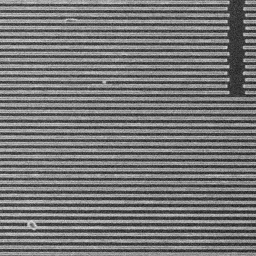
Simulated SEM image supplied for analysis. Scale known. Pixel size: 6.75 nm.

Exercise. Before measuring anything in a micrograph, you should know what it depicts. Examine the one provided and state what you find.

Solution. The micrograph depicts parallel lines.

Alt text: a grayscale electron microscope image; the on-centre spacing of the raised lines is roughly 43.6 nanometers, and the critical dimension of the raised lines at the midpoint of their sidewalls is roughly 18.6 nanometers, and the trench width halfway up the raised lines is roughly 25.3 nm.